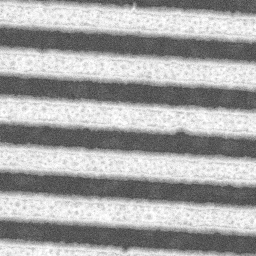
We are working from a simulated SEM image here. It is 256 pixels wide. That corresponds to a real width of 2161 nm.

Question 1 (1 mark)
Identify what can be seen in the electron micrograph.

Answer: parallel lines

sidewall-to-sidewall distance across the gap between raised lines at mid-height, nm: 199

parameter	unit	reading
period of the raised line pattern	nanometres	406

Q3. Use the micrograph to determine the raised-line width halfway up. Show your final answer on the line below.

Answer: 24.6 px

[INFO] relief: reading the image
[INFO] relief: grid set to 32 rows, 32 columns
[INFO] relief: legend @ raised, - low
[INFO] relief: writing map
@@@@@@@@------------------------
@@@@@@@@@@@@@@@@@@@@@@@-@-------
@@@@@@@@@@@@@@@@@@@@@@@@@@@@@@@@
-------@@@@@@@@@@@@@@@@@@@@@@@@@
----------------------@@@@@@@@@@
--------------------------------
@@@@@-@-------------------------
@@@@@@@@@@@@@@@@@@@@@@@---------
@@@@@@@@@@@@@@@@@@@@@@@@@@@@@@@@
------@@@@@@@@@@@@@@@@@@@@@@@@@@
-----------------------@@@@@@@@@
--------------------------------
@@@@@---------------------------
@@@@@@@@@@@@@@@@@@@@@@@---------
@@@@@@@@@@@@@@@@@@@@@@@@@@@@@@@@
----@-@@@@@@@@@@@@@@@@@@@@@@@@@@
---------------------@--@@@@@@@@
--------------------------------
@@@@@@--------------------------
@@@@@@@@@@@@@@@@@@@@@@@---------
@@@@@@@@@@@@@@@@@@@@@@@@@@@@@@@@
-----@@@@@@@@@@@@@@@@@@@@@@@@@@@
---------------------@@@@@@@@@@@
--------------------------------
@@@@@@--------------------------
@@@@@@@@@@@@@@@@@@@@@@@---------
@@@@@@@@@@@@@@@@@@@@@@@@@@@@@@@@
---@-@@@@@@@@@@@@@@@@@@@@@@@@@@@
----------------------@@@@@@@@@@
--------------------------------
@@@@----------------------------
@@@@@@@@@@@@@@@@@@@@@@----------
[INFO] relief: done